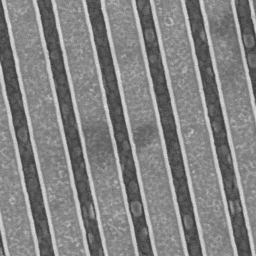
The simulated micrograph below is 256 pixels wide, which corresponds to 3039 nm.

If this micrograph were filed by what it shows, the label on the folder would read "parallel lines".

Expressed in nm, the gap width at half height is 206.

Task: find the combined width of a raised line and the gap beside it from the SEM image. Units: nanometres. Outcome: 573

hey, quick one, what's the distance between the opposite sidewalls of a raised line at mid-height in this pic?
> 0.367 um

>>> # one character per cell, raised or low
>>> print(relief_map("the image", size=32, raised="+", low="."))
.+++...++++..++++..++++..++++..+
.++++..++++..++++..++++..++++...
.++++..++++..++++..++++...++++..
.++++..++++..++++...++++..++++..
.++++...+++...++++..++++..++++..
..++++..++++..++++..++++..++++..
..++++..++++..++++..++++..++++..
..++++..++++..++++..++++...++++.
..++++..++++...+++...++++..++++.
..++++...++++..++++..++++..++++.
...++++..++++..++++..++++..++++.
...++++..++++..++++..++++..++++.
+..++++..++++..++++...+++...++++
+..++++..++++...++++..++++..++++
+..++++...++++..++++..++++..++++
+...++++..++++..++++..++++..++++
++..++++..++++..++++..++++...+++
++..++++..++++..++++...++++..+++
++..++++...+++...++++..++++..+++
++..++++...++++..++++..++++..+++
++...++++..++++..++++..++++..+++
+++..++++..++++..++++..++++...++
+++..++++..++++..++++...++++..++
+++..++++...+++...++++..++++..++
+++...+++...++++..++++..++++..++
++++..++++..++++..++++..++++..++
++++..++++..++++..++++..++++...+
++++..++++..++++..++++...++++..+
++++..++++...++++..++++..++++..+
++++...++++..++++..++++..++++..+
.++++..++++..++++..++++..++++..+
.++++..++++..++++..++++..++++...